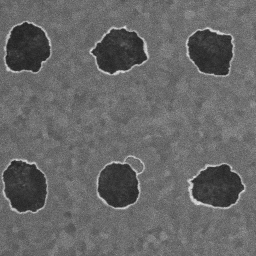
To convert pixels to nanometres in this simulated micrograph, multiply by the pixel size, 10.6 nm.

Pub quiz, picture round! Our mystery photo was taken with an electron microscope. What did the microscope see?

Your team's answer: holes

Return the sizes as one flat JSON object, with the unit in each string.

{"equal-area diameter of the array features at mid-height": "0.496 micrometres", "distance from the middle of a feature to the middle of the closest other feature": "986 nm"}